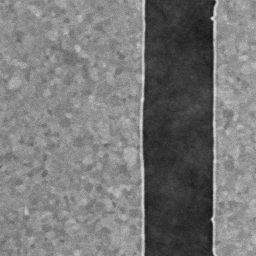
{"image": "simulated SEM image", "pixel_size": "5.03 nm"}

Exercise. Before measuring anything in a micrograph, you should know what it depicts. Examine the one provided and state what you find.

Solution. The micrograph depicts one or a few lines or trenches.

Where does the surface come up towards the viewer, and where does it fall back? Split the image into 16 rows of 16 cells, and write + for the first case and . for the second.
+++++++++....+++
+++++++++....+++
+++++++++....+++
+++++++++....+++
+++++++++....+++
+++++++++....+++
+++++++++....+++
+++++++++....+++
+++++++++....+++
+++++++++....+++
+++++++++....+++
+++++++++....+++
+++++++++....+++
+++++++++....+++
+++++++++....+++
+++++++++....+++